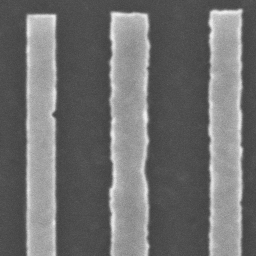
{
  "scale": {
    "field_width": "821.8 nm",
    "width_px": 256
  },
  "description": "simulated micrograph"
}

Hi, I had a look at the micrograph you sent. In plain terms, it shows one or a few lines or trenches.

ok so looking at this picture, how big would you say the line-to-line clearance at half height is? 0.195 µm